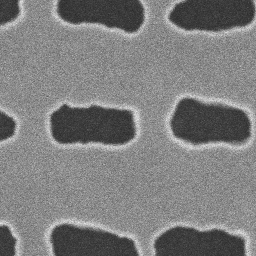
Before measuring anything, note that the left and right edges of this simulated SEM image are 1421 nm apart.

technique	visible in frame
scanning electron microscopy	holes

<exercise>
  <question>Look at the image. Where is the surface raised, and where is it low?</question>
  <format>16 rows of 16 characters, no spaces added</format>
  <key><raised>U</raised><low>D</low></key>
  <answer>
DUUUDDDDDUUDDDDD
UUUUUUDDDUUDDDDU
UUUUUUUUUUUUUUUU
UUUUUUUUUUUUUUUU
UUUUUUUUUUUUUUUU
UUUUUUUUUUUUUUUU
UUUUUUUUUUUDDUUU
DUUDDDDDUUUDDDDD
DUUDDDDDUUUDDDDD
UUUUUUUUUUUUUUUU
UUUUUUUUUUUUUUUU
UUUUUUUUUUUUUUUU
UUUUUUUUUUUUUUUU
UUUUUUUUUUUUUUUU
DUUDDDDUUUDDDDUU
DUUDDDDDDUDDDDDU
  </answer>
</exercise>